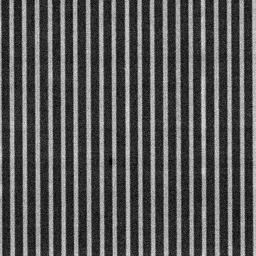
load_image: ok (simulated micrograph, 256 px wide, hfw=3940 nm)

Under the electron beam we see parallel lines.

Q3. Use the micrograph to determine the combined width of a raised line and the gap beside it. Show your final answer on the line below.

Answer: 12.8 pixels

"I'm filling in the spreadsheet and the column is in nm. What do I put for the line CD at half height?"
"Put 59.7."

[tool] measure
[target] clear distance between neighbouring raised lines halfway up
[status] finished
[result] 0.135 microns